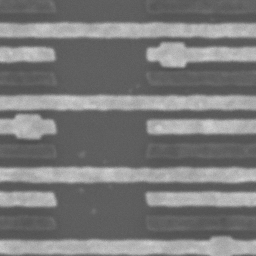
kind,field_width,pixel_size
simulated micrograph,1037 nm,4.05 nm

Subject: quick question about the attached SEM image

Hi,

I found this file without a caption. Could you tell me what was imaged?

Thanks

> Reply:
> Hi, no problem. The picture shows wiring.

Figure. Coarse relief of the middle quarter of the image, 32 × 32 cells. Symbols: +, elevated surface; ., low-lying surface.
..........................++++..
................................
.....................+++++++++++
.....................+++++++++++
.....................+++++++++++
................................
................................
................................
++++++++++++++++++++++++++++++++
++++++++++++++++++++++++++++++++
++++++++++++++++++++++++++++++++
................................
................................
................................
.....................+++++++++++
.....................+++++++++++
.....................+++++++++++
................................
................................
................................
.....................+++++++++++
.....................+++++++++++
.....................+++++++++++
................................
................................
................................
++++++++++++++++++++++++++++++++
++++++++++++++++++++++++++++++++
++++++++++++++++++++++++++++++++
................................
................................
................................